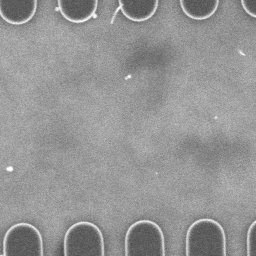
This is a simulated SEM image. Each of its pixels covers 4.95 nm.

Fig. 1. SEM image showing groups of lines, slits or small figures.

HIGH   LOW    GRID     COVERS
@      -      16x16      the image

@@--@@--@@-@@--@
----------------
----------------
----------------
----------------
----------------
----------------
----------------
----------------
----------------
----------------
----------------
----------------
----------------
-@--@@--@@--@@--
@@@-@@--@@--@@-@